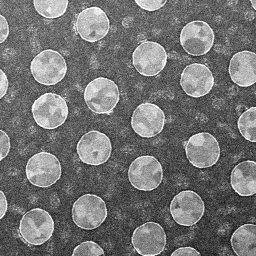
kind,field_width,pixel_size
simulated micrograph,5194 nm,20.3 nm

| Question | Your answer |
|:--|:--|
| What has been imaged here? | a regular array of raised bodies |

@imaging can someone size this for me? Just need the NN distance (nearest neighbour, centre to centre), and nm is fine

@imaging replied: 1080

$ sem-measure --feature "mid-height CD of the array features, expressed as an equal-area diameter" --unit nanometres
689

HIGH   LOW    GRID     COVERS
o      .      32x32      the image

....oooo.........ooo............
.....ooo..ooo...................
o.........ooo...................
o.........oooo.........ooo......
o.........ooo..........oooo.....
..................oo...ooo......
.....oo..........oooo...oo....o.
....oooo.........oooo........ooo
....oooo.........ooo...ooo...ooo
o...oooo...............oooo..ooo
o.....o....ooo.........oooo...o.
o..........oooo........ooo......
.....ooo...oooo.................
....oooo...ooo...ooo............
....oooo.........ooo..........oo
.....ooo.........ooo..........oo
...........o.....ooo..........oo
o.........oooo..........ooo....o
o.........oooo.........oooo.....
o...ooo...oooo.........oooo.....
...oooo....o.....ooo....ooo...oo
...ooooo........oooo.........ooo
....ooo.........oooo.........ooo
.................oo..........ooo
o..........o..........ooo.......
o........oooo........oooo.......
o...oo...oooo........oooo.......
...ooo...oooo.........ooo.......
...oooo...oo.....ooo..........oo
...ooo...........oooo........ooo
..........oo.....oooo........ooo
.........oooo....ooo..ooo....ooo